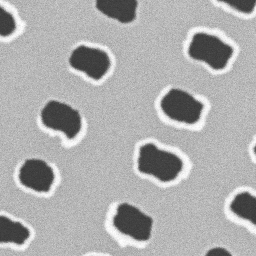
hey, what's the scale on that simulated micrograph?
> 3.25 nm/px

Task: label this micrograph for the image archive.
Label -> holes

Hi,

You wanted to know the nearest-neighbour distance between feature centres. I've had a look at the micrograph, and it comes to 0.203 microns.